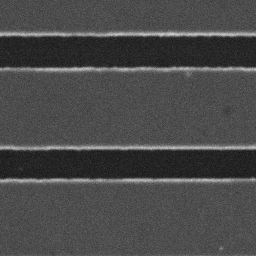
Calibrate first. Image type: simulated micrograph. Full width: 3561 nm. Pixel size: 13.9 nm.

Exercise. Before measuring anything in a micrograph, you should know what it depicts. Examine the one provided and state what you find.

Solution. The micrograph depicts lines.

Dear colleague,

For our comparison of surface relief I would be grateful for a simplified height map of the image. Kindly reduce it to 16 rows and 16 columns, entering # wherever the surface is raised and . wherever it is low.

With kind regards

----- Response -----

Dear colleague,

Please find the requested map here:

################
################
................
................
################
################
################
################
################
................
................
################
################
################
################
################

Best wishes